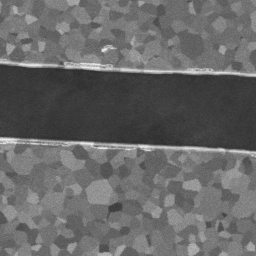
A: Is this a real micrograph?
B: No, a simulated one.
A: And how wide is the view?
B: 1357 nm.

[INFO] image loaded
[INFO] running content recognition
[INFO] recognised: one or a few lines or trenches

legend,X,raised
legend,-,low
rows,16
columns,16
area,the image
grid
XXXXXXXXXXXXXXXX
XXXXXXXXXXXXXXXX
XXXXXXXXXXXXXXXX
XXXXXXXXXXXXXXXX
------------XXXX
----------------
----------------
----------------
----------------
XXXXXXXXXXXXXXX-
XXXXXXXXXXXXXXXX
XXXXXXXXXXXXXXXX
XXXXXXXXXXXXXXXX
XXXXXXXXXXXXXXXX
XXXXXXXXXXXXXXXX
XXXXXXXXXXXXXXXX